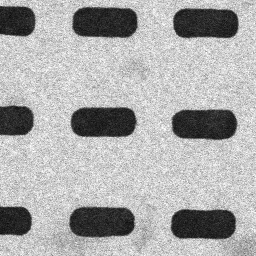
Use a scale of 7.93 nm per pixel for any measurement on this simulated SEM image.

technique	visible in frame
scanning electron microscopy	holes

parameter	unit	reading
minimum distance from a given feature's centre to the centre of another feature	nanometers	792